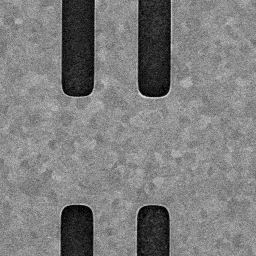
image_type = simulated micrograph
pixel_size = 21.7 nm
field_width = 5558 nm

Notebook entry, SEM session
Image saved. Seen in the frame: groups of lines, slits or small figures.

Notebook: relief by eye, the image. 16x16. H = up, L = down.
HHHHLLHHHLLHHHHH
HHHHLLHHHLLHHHHH
HHHHLLHHHLLHHHHH
HHHHLLHHHLLHHHHH
HHHHLLHHHLLHHHHH
HHHHLLHHHLLHHHHH
HHHHHHHHHHHHHHHH
HHHHHHHHHHHHHHHH
HHHHHHHHHHHHHHHH
HHHHHHHHHHHHHHHH
HHHHHHHHHHHHHHHH
HHHHHHHHHHHHHHHH
HHHHHHHHHHHHHHHH
HHHHLLHHHLLHHHHH
HHHHLLHHHLLHHHHH
HHHHLLHHHLLHHHHH